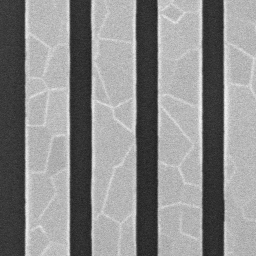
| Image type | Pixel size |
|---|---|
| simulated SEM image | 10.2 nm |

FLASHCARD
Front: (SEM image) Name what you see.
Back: wiring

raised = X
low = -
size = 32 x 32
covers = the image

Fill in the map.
---XXXXXX--XXXXXX---XXXXX---XXXX
---XXXXXX--XXXXXX---XXXXX---XXXX
---XXXXXX--XXXXXX---XXXXX---XXXX
---XXXXXX--XXXXXX---XXXXX---XXXX
---XXXXXX---XXXXX---XXXXX---XXXX
---XXXXXX---XXXXX---XXXXX---XXXX
---XXXXXX---XXXXX---XXXXX---XXXX
---XXXXXX---XXXXX---XXXXX---XXXX
---XXXXXX---XXXXX---XXXXX---XXXX
---XXXXXX---XXXXX---XXXXX---XXXX
---XXXXXX---XXXXX---XXXXX---XXXX
---XXXXXX--XXXXXX---XXXXX---XXXX
---XXXXXX--XXXXXX---XXXXX---XXXX
---XXXXXX--XXXXXX---XXXXX---XXXX
---XXXXXX---XXXXX---XXXXX---XXXX
---XXXXXX---XXXXX---XXXXX---XXXX
---XXXXXX---XXXXX---XXXXX---XXXX
---XXXXXX---XXXXX---XXXXX---XXXX
---XXXXXX---XXXXX---XXXXX---XXXX
---XXXXXX---XXXXX---XXXXX---XXXX
---XXXXXX---XXXXX---XXXXX---XXXX
---XXXXXX---XXXXX---XXXXX---XXXX
---XXXXXX--XXXXXX---XXXXX---XXXX
---XXXXXX--XXXXXX---XXXXX---XXXX
---XXXXXX--XXXXXX---XXXXX---XXXX
---XXXXXX--XXXXXX---XXXXX---XXXX
---XXXXXX---XXXXX---XXXXX---XXXX
---XXXXXX---XXXXX---XXXXX---XXXX
---XXXXXX--XXXXXX---XXXXX---XXXX
---XXXXXX--XXXXXX---XXXXX---XXXX
---XXXXXX---XXXXX---XXXXX---XXXX
---XXXXXX---XXXXX---XXXXX---XXXX